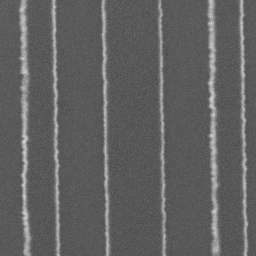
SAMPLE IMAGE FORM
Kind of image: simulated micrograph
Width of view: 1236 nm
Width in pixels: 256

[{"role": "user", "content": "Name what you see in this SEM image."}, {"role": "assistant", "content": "lines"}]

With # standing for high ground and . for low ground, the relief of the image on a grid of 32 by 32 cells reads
...####......#######......####..
...####......#######......####..
...####......#######......####..
...####......#######......####..
...####......#######......####..
...####......#######......####..
...####......#######......####..
...####......#######......####..
...####......#######......####..
...####......#######......#####.
...####......#######......####..
...####......#######......####..
...####......#######......#####.
...####......#######.......####.
...####......#######.......####.
...####......#######.......####.
...####......#######.......####.
...####......#######.......####.
...####......#######.......####.
...####......#######.......####.
...####......#######.......####.
...####......#######.......####.
...####......#######.......####.
...####......#######.......####.
...####......#######.......####.
...####......#######.......####.
...####......#######.......####.
...####......########......####.
...####......########......####.
...####......########......####.
...####......########......####.
...####......########......####.